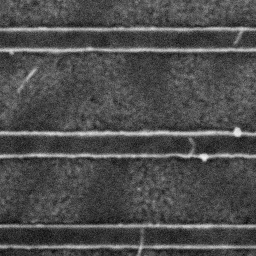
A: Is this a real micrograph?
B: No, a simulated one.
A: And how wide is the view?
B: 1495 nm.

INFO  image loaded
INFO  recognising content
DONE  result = lines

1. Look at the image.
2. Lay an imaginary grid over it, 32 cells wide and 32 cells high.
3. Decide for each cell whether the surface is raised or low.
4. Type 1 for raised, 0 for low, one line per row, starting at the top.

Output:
00000000000000000000000000000000
00000000000000000000000000000000
00000000000000000000000000000000
00000000000000000000000000000000
11111111111111111111111111111111
11111111111111111111111111111111
00000000000000000000000000000000
00000000000000000000000000000000
00000000000000000000000000000000
00000000000000000000000000000000
00000000000000000000000000000000
00000000000000000000000000000000
00000000000000000000000000000000
00000000000000000000000000000000
00000000000000000000000000000000
00000000000000000000000000000000
00000000000000000000000000110100
11111111111111111111111111111111
11111111111111111111111111111111
11111111111111111111101111111111
00000000000000000000000000000000
00000000000000000000000000000000
00000000000000000000000000000000
00000000000000000000000000000000
00000000000000000000000000000000
00000000000000000000000000000000
00000000000000000000000000000000
00000000000000000000000000000000
11111111111111111111111111111111
11111111111111111111111111111111
11111111111111111111111111111111
00000000000000000000000000000000